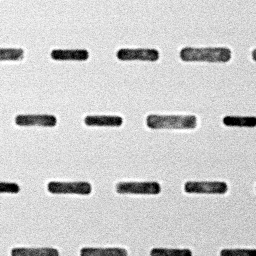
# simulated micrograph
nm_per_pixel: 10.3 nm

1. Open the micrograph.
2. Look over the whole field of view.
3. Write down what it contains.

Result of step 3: a regular array of holes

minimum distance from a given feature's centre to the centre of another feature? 0.698 micrometres